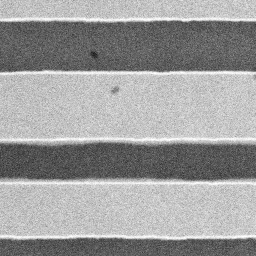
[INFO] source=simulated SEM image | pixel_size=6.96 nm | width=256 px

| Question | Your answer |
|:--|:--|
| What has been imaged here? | lines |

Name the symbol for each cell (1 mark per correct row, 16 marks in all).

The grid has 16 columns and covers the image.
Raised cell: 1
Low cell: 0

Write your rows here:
1111111111111111
0000000000000000
0000000000000000
0000000000000000
0011011000010110
1111111111111111
1111111111111111
1111111111111111
1111111111111111
0000000000000000
0000000000000000
1111111111111111
1111111111111111
1111111111111111
1111111111111111
0000000000000000